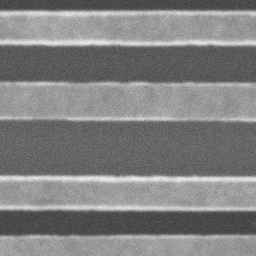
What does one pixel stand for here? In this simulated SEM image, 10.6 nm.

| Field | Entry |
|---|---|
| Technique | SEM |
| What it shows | lines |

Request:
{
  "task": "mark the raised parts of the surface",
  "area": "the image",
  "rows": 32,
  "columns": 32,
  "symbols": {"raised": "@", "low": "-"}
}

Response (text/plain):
--------------------------------
@@@@@@---@@@@@@@@@@@@@@@@@@@@@@@
@@@@@@@@@@@@@@@@@@@@@@@@@@@@@@@@
@@@@@@@@@@@@@@@@@@@@@@@@@@@@@@@@
@@@@@@@@@@@@@@@@@@@@@@@@@@@@@@@@
------@@-------@@@@@@@-----@@@@-
--------------------------------
--------------------------------
--------------------------------
--------------------------------
@@@@@@@@@--@@@@-@@@----@@-------
@@@@@@@@@@@@@@@@@@@@@@@@@@@@@@@@
@@@@@@@@@@@@@@@@@@@@@@@@@@@@@@@@
@@@@@@@@@@@@@@@@@@@@@@@@@@@@@@@@
@@@@@@@@@@@@@@@@@@@@@@@@@@@@@@@@
--------------------------------
--------------------------------
--------------------------------
--------------------------------
--------------------------------
--------------------------------
--------------------------------
@@@@@@@@@@@@@@@@@@@@@@@@@@@@@@@@
@@@@@@@@@@@@@@@@@@@@@@@@@@@@@@@@
@@@@@@@@@@@@@@@@@@@@@@@@@@@@@@@@
@@@@@@@@@@@@@@@@@@@@@@@@@@@@@@@@
--------------------------------
--------------------------------
--------------------------------
--------------------------------
@@@@@@@@@@@@@@@@@@@@@@@@@@@@@@@@
@@@@@@@@@@@@@@@@@@@@@@@@@@@@@@@@